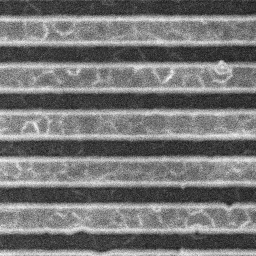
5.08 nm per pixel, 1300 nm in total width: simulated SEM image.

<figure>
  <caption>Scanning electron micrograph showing parallel lines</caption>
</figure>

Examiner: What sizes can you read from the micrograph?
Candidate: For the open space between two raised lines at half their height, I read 106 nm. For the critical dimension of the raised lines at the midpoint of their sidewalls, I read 133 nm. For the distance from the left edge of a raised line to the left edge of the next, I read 46.8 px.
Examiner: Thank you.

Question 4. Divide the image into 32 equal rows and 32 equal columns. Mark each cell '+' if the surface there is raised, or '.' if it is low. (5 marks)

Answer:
................................
................................
++++++++++++++++++++++++++++++++
++++++++++++++++++++++++++++++++
++++++++++++++++++++++++++++++++
++......+..........+............
................................
................................
++++++++++++++++++++++++++++++++
++++++++++++++++++++++++++++++++
++++++++++++++++++++++++++++++++
................................
................................
................................
++++++++++++++++++++++++++++++++
++++++++++++++++++++++++++++++++
++++++++++++++++++++++++++++++++
................................
................................
................................
++++++++++++++++++++++++++++++++
++++++++++++++++++++++++++++++++
++++++++++++++++++++++++++++++++
................................
................................
................................
++++++++++++++++++++++++++++++++
++++++++++++++++++++++++++++++++
++++++++++++++++++++++++++++++++
................................
................................
......................+.........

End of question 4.